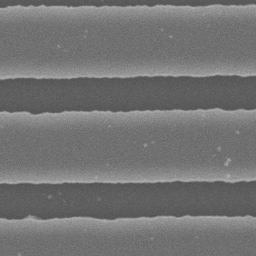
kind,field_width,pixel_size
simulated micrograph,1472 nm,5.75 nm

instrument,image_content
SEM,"lines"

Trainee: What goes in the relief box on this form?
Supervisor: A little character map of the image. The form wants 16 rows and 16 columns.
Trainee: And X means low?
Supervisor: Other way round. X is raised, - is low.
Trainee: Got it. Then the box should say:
XXXXXXXXXXXXXXXX
XXXXXXXXXXXXXXXX
XXXXXXXXXXXXXXXX
XXXXXXXXXXXXXXXX
XXXXXXXXXXXXXXXX
----------------
----------------
XXXXXXXXXXXXXXXX
XXXXXXXXXXXXXXXX
XXXXXXXXXXXXXXXX
XXXXXXXXXXXXXXXX
----------------
----------------
----------------
XXXXXXXXXXXXXXXX
XXXXXXXXXXXXXXXX